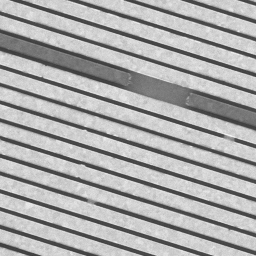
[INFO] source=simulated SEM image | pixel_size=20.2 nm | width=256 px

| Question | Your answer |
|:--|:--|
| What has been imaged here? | parallel lines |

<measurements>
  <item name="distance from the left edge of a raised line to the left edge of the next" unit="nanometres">344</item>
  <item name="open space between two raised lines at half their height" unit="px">4.05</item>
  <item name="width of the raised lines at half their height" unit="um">0.263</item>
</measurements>